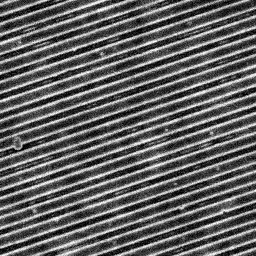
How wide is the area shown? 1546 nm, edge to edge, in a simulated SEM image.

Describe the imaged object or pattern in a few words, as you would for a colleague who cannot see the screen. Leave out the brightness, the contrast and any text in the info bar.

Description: parallel lines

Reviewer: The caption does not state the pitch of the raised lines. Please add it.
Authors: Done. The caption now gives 111 nm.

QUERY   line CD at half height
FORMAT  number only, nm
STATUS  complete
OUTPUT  65.3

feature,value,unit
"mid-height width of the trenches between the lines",43.7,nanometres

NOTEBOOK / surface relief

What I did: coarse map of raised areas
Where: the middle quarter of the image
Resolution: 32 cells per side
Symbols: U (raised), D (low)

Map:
UUUUDDDDDDDUUUUUUUUDDDDDDUUUUUUU
UDDDDDDDUUUUUUUUDDDDDDUUUUUUUUDD
DDDDDUUUUUUUUDDDDDDUUUUUUUUDDDDD
DDUUUUUUUUDDDDDDUUUUUUUUDDDDDDDU
UUUUUUUDDDDDDUUUUUUUUDDDDDDDUUUU
UUUUDDDDDDUUUUUUUUDDDDDDDUUUUUUU
UDDDDDDUUUUUUUUDDDDDDDUUUUUUUUDD
DDDDUUUUUUUUDDDDDDDUUUUUUUUDDDDD
DUUUUUUUUDDDDDDDUUUUUUUUDDDDDDUU
UUUUUUDDDDDDDUUUUUUUUDDDDDDUUUUU
UUUDDDDDDDUUUUUUUUDDDDDDUUUUUUUU
DDDDDDDUUUUUUUUDDDDDDUUUUUUUUDDD
DDDDUUUUUUUUDDDDDDUUUUUUUUDDDDDD
DUUUUUUUUDDDDDDUUUUUUUUDDDDDDDUU
UUUUUUDDDDDDUUUUUUUUDDDDDDDUUUUU
UUUDDDDDDUUUUUUUUDDDDDDDUUUUUUUU
DDDDDDUUUUUUUUDDDDDDDUUUUUUUUDDD
DDDUUUUUUUUDDDDDDDUUUUUUUUDDDDDD
UUUUUUUUDDDDDDDUUUUUUUUDDDDDDUUU
UUUUUDDDDDDDUUUUUUUUDDDDDDUUUUUU
UUDDDDDDDUUUUUUUUDDDDDDUUUUUUUUU
DDDDDDUUUUUUUUDDDDDDUUUUUUUUUDDD
DDDUUUUUUUUDDDDDDUUUUUUUUUDDDDDD
UUUUUUUUDDDDDDUUUUUUUUUDDDDDDUUU
UUUUUDDDDDDUUUUUUUUUDDDDDDUUUUUU
UUDDDDDDUUUUUUUUUDDDDDDUUUUUUUUD
DDDDDUUUUUUUUUDDDDDDUUUUUUUUDDDD
DDUUUUUUUUDDDDDDDUUUUUUUUDDDDDDU
UUUUUUUDDDDDDDUUUUUUUUDDDDDDUUUU
UUUUDDDDDDDUUUUUUUUDDDDDDUUUUUUU
UDDDDDDDUUUUUUUUDDDDDDUUUUUUUUUD
DDDDDUUUUUUUUDDDDDDUUUUUUUUUDDDD